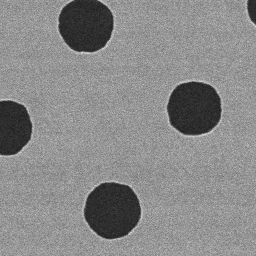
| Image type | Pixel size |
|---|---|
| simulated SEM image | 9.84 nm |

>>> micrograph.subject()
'holes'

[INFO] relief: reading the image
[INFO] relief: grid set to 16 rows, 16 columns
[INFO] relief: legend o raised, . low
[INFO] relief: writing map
oooo...oooooooo.
oooo...ooooooooo
oooo...ooooooooo
oooooooooooooooo
oooooooooooooooo
ooooooooooo..ooo
.ooooooooo....oo
..ooooooooo...oo
..oooooooooooooo
.ooooooooooooooo
oooooooooooooooo
oooooo..oooooooo
ooooo....ooooooo
ooooo....ooooooo
oooooo..oooooooo
oooooooooooooooo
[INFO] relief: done